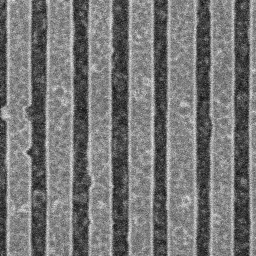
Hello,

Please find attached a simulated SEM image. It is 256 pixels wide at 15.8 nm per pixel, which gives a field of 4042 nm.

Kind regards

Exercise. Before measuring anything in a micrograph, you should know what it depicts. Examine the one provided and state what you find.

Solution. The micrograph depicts parallel lines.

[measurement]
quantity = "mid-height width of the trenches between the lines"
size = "276 nm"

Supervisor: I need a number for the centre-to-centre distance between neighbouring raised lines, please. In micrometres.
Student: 0.643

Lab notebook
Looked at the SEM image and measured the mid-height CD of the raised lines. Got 22.5 pixels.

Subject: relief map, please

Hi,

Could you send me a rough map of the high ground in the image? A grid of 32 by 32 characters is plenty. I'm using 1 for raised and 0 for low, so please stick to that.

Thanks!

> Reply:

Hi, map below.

01110011100111001110011100111001
01110011100111001110011100111001
01110111100111001110011100111001
01110011100111001110011100111001
01111011100111001110011100111001
01110011100111001110011100111001
01110011100111001110011100111001
01110011100111001110011100111001
01110011100111001110011100011001
01110011100111001110011100011001
01110011100111001110011100011001
01110011100111001110011100111001
01110011100111001110011100111001
11100011100111001110011100111001
11100011100111001110011100111001
01110011100111001110011100011001
01110011100111011110011100011001
01110011100111001110011100011001
01110011100111001110011100011001
01100011100111001110011100011001
01110011100111001110011100011001
01110011100111001110011100011001
01110011100111001110011100111001
01110011100111001110011100111001
01111111101111001110011100011001
01111011100111001110011100011001
01110011100111001110011100011001
01110011100111001110011100011001
01110011100111001110011100011001
01110011100111001110011100111001
01110011100111001110011100111001
01110011100111001110011100111001